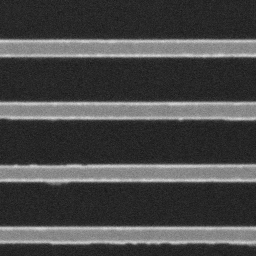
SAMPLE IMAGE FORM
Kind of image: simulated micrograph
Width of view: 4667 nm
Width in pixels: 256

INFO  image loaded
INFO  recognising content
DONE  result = lines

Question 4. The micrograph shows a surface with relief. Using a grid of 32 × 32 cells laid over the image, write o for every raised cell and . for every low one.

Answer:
................................
................................
................................
................................
................................
oooooooooooooooooooooooooooooooo
oooooooooooooooooooooooooooooooo
................................
................................
................................
................................
................................
................................
oooooooooooooooooooooooooooooooo
oooooooooooooooooooooooooooooooo
................................
................................
................................
................................
................................
................................
oooooooooooooooooooooooooooooooo
oooooooooooooooooooooooooooooooo
................................
................................
................................
................................
................................
oooooooooooooooooooooooooooooooo
oooooooooooooooooooooooooooooooo
................................
................................